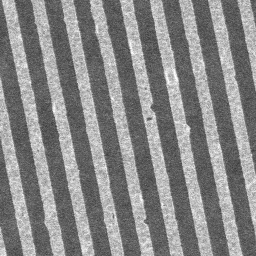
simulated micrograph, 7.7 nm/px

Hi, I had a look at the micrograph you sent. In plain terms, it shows parallel lines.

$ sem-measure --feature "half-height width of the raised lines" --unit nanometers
87.8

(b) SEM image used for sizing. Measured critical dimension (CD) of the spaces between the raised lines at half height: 134 nanometres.